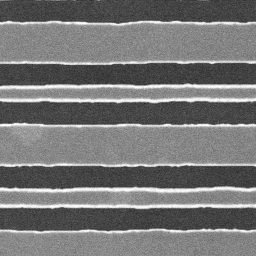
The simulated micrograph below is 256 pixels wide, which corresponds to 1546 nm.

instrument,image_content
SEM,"lines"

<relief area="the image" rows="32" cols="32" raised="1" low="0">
00000000000000000000000000000000
00000000000000000000000000000000
00000000000000000000000000000000
11111111111111111111111111111111
11111111111111111111111111111111
11111111111111111111111111111111
11111111111111111111111111111111
11111111111111111111111111111111
00000000000000000000000000000000
00000000000000000000000000000000
00000000000000000000000000000000
11111111111111111111111111111111
11111111111111111111111111111111
00000000000000000000000000000000
00000000000000000000000000000000
01110000000000000000000000000000
11111111111111111111111111111111
11111111111111111111111111111111
11111111111111111111111111111111
11111111111111111111111111111111
11111111111111111111111111111111
00000000000000000000000000000000
00000000000000000000000000000000
00000000000000000000000000001000
11111111111111111111111111111111
11111111111111111111111111111111
00000000000000000000000000000000
00000000000000000000000000000000
00000000000000000000000000000000
11111111111111111111111111111111
11111111111111111111111111111111
11111111111111111111111111111111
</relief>